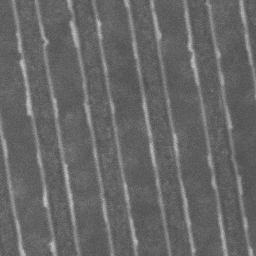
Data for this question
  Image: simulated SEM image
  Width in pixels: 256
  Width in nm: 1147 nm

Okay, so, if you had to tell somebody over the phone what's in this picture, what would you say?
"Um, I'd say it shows parallel lines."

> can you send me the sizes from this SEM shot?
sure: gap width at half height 98.9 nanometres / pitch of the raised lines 0.252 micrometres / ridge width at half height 152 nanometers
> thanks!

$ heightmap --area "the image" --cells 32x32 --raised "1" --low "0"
11000111100011110001111000111100
11000111100011110001111000111100
11000111100011110001111100111110
11000111100011111001111100111110
11100111110011111000111100011110
11100011110001111000111100011110
11100011110001111000111100011110
11100011110001111000111100011110
11100011110001111000111110011111
11100011110001111100111110011111
11100011111001111100011110001111
11110011111000111100011110001111
11110001111000111100011110001111
11110001111000111100011110001111
11110001111000111100011111001111
11110001111000111110011111001111
11110001111100111110001111000111
11111001111100011110001111000111
11111000111100011110001111000111
01111000111100011110001111000111
01111000111100011110001111000111
01111000111100011111001111100011
01111000111110011111001111100011
01111100111110001111000111100011
01111100011110001111000111100011
00111100011110001111000111100011
00111100011110001111000111100011
00111100011110001111100111110011
00111100011111001111100011110001
00111110011111000111100011110001
00111110001111000111100011110001
00011110001111000111100011110001